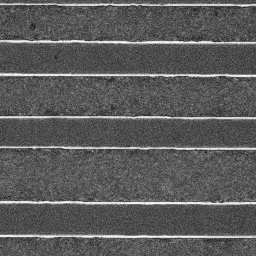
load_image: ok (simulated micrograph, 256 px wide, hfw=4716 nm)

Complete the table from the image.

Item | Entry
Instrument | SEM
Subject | lines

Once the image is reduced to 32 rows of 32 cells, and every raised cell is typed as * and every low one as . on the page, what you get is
********************************
................................
................................
................................
................................
********************************
********************************
********************************
********************************
................................
................................
................................
................................
................................
................................
********************************
********************************
********************************
.................**...**********
................................
................................
................................
................................
................................
................................
********************************
********************************
********************************
********************************
********************************
................................
................................